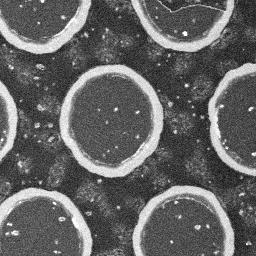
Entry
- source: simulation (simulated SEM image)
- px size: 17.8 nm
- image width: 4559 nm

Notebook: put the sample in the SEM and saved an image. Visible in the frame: raised bodies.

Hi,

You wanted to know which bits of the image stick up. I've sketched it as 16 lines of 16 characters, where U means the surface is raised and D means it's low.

UUUUUDDDDUUUUUDD
UUUUUDDDDUUUUUDD
DUUUDDDDDDUUUDDD
DDDDDDDDDDDDDDDD
DDDDDDUUDDDDDDDU
DDDDDUUUUDDDDDUU
UDDDUUUUUUDDDUUU
UDDDUUUUUUDDDUUU
UDDDUUUUUUDDDUUU
DDDDDUUUUDDDDDUU
DDDDDDUUDDDDDDDU
DDDDDDDDDDDDDDDD
DUUUDDDDDDUUUDDD
UUUUUDDDDUUUUUDD
UUUUUDDDDUUUUUDD
UUUUUDDDDUUUUUDD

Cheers